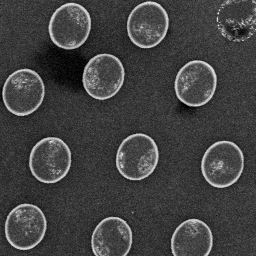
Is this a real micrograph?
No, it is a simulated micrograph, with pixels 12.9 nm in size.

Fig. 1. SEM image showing a regular array of raised bodies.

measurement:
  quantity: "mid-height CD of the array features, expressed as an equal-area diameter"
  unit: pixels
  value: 42.6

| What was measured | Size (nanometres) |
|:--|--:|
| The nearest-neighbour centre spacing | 916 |